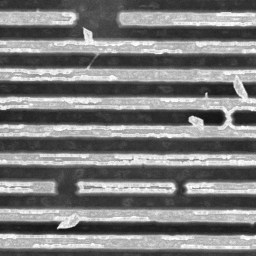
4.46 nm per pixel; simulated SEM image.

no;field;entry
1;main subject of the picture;parallel lines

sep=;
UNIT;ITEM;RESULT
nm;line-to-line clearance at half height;61.3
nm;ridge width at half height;61.3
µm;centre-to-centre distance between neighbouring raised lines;0.124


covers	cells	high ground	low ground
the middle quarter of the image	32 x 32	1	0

00000000000000000000000000000000
11111111111111111111111111111111
11111111111111111111111111111111
11111111111111111111111111111111
00000000000000000000000000000000
00000000000000000000000000000000
00000000000000000000000000000000
00000000000000000000000000000000
11111111111111111111111111111111
11111111111111111111111111111111
11111111111111111111111111111111
00000000000000001111111001111110
00000000000000000000000000000000
00000000000000000000000000000000
00000000000000000000000000000000
11111111111111111111111111111111
11111111111111111111111111111111
11111111111111111111111111111111
00000000111100011100000100011111
00000000000000000000000000000000
00000000000000000000000000000000
00000000000000000000000000000000
11111111111111111111100000110001
11111111111111111111111111111111
11111111111111111111111111111111
00000000000000000000000000000001
00000000000000000000000000000000
00000000000000000000000000000000
00000000000000000000000000000000
00001111111111111111111111100001
00001111111111111111111111110011
00001111111111111111111111110001